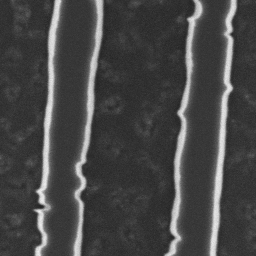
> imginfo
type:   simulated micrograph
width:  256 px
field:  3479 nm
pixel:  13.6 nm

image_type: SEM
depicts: one or a few lines or trenches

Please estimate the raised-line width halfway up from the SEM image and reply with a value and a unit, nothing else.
546 nanometers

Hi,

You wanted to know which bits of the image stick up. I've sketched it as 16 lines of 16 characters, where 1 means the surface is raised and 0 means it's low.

0000110000001110
0001110000001100
0001110000001100
0001110000001100
0001110000001100
0001110000001100
0001110000011100
0001110000011100
0001100000011100
0001100000011100
0001100000011100
0001100000011100
0001100000011100
0001100000011100
0001100000011000
0001100000011000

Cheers